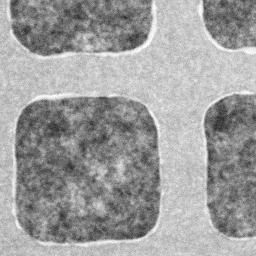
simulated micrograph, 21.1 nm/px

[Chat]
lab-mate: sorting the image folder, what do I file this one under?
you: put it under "holes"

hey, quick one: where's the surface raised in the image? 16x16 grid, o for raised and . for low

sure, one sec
o.........ooo...
o.........ooo...
o........oooo...
oo..oooooooooooo
oooooooooooooooo
oooooooooooooooo
oo.......oooo...
o.........ooo...
o.........ooo...
o.........ooo...
o.........ooo...
o.........ooo...
o.........ooo...
o.........ooo...
oo.......ooooo..
oooooooooooooooo